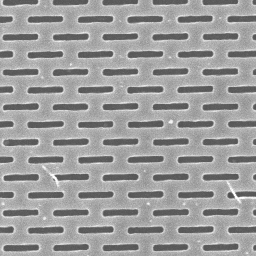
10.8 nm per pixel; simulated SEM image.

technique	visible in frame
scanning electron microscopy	a regular array of holes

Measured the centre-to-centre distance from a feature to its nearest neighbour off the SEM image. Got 328 nm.